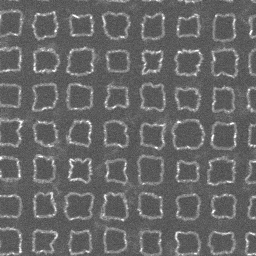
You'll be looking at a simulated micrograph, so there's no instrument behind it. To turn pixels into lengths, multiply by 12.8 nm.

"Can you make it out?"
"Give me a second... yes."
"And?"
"a regular array of raised bodies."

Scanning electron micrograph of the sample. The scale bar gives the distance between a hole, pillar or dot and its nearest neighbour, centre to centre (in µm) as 0.444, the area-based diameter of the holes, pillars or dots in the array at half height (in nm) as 307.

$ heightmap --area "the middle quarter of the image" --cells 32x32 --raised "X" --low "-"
-XXXXXX----XXXXX----XXXX----XXXX
-XXXXXX-----XXXX----XXX-----XXXX
---XX--------------------------X
--------------------------------
--------------------------------
-XXXX---------------XX-X--------
-XXXXXX----XXXXX---XXXXXX---XX-X
-XXXXXX----XXXXX---XXXXXX---XXXX
-XXXXXX----XXXXX----XXXXX---XXXX
-XXXXXX---XXXXXX----XXXXX---XXXX
-XXXXXX---XXX-------XXXXX----XXX
--------------------------------
--------------------------------
--------------------------------
---XXX------X-----------------XX
--XXXXX---XXXXX-----XXXXX---XXXX
--XXXXX---XXXXXX---XXXXXX--XXXXX
-XXXXX----XXXXX----XXXXXX--XXXXX
-XXXXX----XXXXXX----XXXXX---XXXX
--XXXX----XXXXXX---XXXXXX---XXXX
--------------X-------XXX---XXXX
--------------------------------
--------------------------------
-------------------XXXX---------
--XXXX------XXX----XXXXX-----X--
--XXXX-----XXXX----XXXXXX----XXX
--XXXXX----XXXX----XXXXXX----XXX
--XXXX-----XXXX----XXXXX----XXXX
-XXXXX-----XXXXX---XXXXX----XXXX
--------------X----XXXXX--------
--------------------------------
--------------------------------